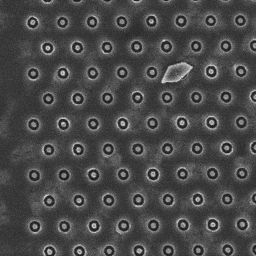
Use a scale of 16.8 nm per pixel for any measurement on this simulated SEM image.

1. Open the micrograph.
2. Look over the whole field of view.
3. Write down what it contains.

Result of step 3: a regular array of ring-shaped grooves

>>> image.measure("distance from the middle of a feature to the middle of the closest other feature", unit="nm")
490